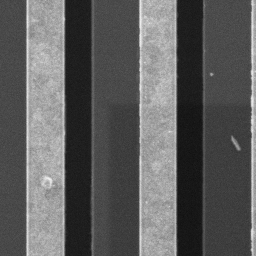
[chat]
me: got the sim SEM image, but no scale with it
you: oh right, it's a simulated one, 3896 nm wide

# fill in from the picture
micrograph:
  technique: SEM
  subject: lines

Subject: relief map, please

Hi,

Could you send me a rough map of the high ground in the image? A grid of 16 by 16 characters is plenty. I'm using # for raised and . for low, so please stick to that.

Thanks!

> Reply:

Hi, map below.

####..#####..###
####..#####..###
####..#####..###
####..#####..###
####..#####..###
####..#####..###
####..#####..###
####..#####..###
####..#####..###
####..#####..###
####..#####..###
####..#####..###
####..#####..###
####..#####..###
####..#####..###
####..#####..###